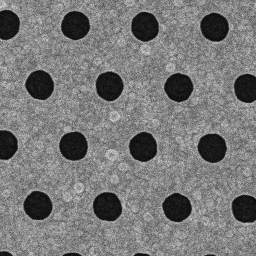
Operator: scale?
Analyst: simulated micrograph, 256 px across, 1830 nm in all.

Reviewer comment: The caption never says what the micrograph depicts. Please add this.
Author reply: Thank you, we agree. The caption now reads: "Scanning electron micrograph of a regular array of holes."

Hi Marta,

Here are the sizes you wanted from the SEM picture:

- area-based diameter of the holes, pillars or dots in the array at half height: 205 nanometers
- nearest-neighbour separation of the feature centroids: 496 nanometers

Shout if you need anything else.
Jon